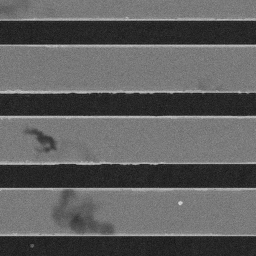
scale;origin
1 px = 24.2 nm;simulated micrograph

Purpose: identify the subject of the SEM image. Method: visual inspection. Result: lines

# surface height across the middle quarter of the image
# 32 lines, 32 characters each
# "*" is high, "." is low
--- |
********************************
********************************
********************************
********************************
********************************
********************************
********************************
................................
................................
................................
................................
................................
................................
********************************
********************************
********************************
********************************
********************************
********************************
********************************
********************************
********************************
********************************
********************************
********************************
................................
................................
................................
................................
................................
................................
********************************